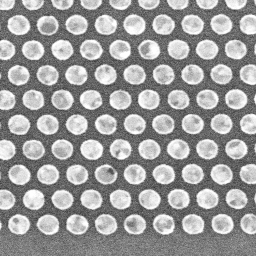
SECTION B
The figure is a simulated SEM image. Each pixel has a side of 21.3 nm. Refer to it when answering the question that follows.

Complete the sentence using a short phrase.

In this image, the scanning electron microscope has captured a regular array of raised bodies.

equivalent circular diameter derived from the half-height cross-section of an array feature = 409 nanometers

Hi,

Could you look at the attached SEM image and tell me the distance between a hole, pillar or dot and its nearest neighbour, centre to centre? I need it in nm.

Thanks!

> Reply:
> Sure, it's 609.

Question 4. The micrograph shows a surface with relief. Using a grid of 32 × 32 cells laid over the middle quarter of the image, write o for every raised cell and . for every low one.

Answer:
................................
.oooo...oooo....oooo...oooo...oo
.ooooo..ooooo..ooooo..ooooo...oo
.ooooo..ooooo..ooooo...oooo...oo
.oooo....ooo....ooo.....oo.....o
................................
................................
o....oooo...oooo...oooo...ooooo.
oo..ooooo...oooo...ooooo..ooooo.
oo..ooooo...oooo...ooooo..ooooo.
oo...oooo...oooo....ooo....ooo..
................................
................................
..ooo....ooo....ooo....oooo...oo
.oooo...ooooo..ooooo..ooooo...oo
.ooooo..ooooo..ooooo..ooooo...oo
.oooo....oooo...oooo...oooo...oo
................................
................................
o.....oo.....oo.....oo.....ooo..
oo..ooooo...oooo...oooo...ooooo.
oo..ooooo...oooo...ooooo..ooooo.
oo...oooo...oooo...ooooo...oooo.
.....................o......o...
................................
.................o.......o.....o
.oooo...ooooo..ooooo...oooo...oo
.ooooo..ooooo..ooooo...oooo...oo
.ooooo..ooooo..ooooo...oooo...oo
..ooo....ooo.....oo.....oo.....o
................................
................................